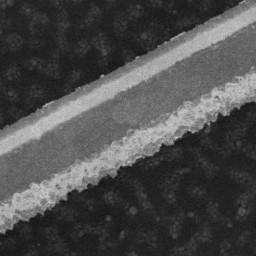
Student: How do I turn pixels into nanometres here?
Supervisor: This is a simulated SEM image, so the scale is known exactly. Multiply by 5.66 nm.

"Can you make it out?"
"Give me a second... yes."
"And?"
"one or a few lines or trenches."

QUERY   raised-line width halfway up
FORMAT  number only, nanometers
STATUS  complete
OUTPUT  336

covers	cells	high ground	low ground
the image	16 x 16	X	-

----------------
---------------X
-------------XXX
-----------XXXXX
---------XXXXXXX
-------XXXXXXXX-
-----XXXXXXXX---
---XXXXXXXX-----
-XXXXXXXX-------
XXXXXXXX--------
XXXXXX----------
XXX-------------
XX--------------
----------------
----------------
----------------